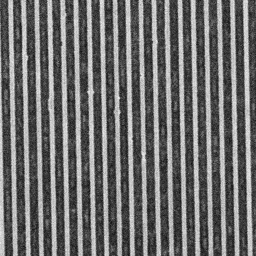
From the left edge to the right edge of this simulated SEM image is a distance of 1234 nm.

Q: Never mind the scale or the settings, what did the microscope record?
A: parallel lines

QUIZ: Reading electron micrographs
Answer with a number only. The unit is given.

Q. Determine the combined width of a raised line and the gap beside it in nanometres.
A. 62.8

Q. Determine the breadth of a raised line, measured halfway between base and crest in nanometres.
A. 19.3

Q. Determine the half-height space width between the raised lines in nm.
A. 42.7